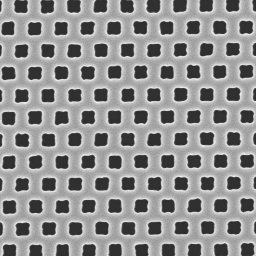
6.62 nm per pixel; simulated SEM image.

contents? a regular array of holes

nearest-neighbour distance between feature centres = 170 nanometers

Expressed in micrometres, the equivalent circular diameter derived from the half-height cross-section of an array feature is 0.0951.